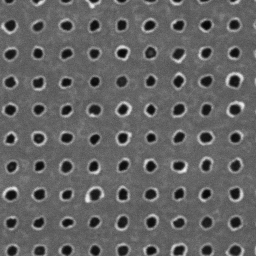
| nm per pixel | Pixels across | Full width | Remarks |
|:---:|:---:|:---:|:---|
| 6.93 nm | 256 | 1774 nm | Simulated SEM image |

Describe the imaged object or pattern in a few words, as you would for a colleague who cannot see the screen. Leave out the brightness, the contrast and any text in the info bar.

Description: a regular array of holes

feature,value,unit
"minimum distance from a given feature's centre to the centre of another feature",27.6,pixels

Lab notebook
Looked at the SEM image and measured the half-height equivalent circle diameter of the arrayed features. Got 74.6 nanometres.